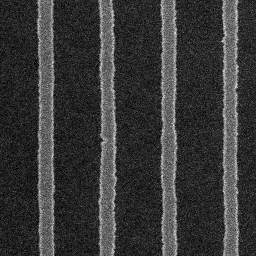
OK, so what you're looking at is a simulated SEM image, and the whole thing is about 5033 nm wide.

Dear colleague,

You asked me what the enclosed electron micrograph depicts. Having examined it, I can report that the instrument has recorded one or a few lines or trenches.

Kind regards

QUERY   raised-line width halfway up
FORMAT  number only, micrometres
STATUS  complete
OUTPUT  0.268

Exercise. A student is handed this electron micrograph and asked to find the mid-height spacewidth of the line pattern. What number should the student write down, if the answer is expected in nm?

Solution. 946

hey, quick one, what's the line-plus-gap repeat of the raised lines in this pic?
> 1210 nm